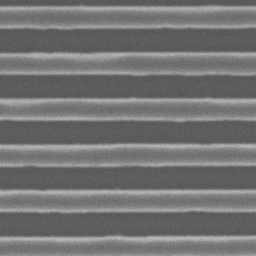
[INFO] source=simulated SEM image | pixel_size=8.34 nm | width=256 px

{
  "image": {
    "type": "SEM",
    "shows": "lines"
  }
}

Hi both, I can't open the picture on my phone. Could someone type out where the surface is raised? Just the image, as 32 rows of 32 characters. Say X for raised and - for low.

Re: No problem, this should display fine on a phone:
--------------------------------
XXXXXXXXXXXXXXXXXXXXXXXXXXXXXXXX
XXXXXXXXXXXXXXXXXXXXXXXXXXXXXXXX
-------XX-----------------------
--------------------------------
--------------------------------
--------------------------------
XXXXXXXXXXXXXXXXXXXXXXXXXXXXXXXX
XXXXXXXXXXXXXXXXXXXXXXXXXXXXXXXX
--------------------------------
--------------------------------
--------------------------------
----XXXXXXXXXXXXXXXXXXXXXXXXXXXX
XXXXXXXXXXXXXXXXXXXXXXXXXXXXXXXX
XXXXXXXXXXXXXXXXXXXXXXXXXXXXXXXX
--------------------------------
--------------------------------
--------------------------------
XXXXXXXXXXXXXXXXXXXXXXXXXXXXXXXX
XXXXXXXXXXXXXXXXXXXXXXXXXXXXXXXX
XXXXXXXXXXXXXXXXXXXXXXXXXXXXXXXX
--------------------------------
--------------------------------
--------------------------------
XXXXXXXXXXXXXXXXXXXXXXXXXXXXXXXX
XXXXXXXXXXXXXXXXXXXXXXXXXXXXXXXX
--------X-----------------------
--------------------------------
--------------------------------
--------------------------------
XXXXXXXXXXXXXXXXXXXXXXXXXXXXXXXX
XXXXXXXXXXXXXXXXXXXXXXXXXXXXXXXX